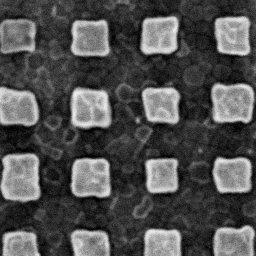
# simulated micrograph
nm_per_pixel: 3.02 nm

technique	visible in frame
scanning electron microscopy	a regular array of raised bodies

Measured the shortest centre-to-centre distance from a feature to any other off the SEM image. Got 0.209 microns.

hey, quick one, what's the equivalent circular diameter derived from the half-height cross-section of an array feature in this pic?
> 0.118 micrometres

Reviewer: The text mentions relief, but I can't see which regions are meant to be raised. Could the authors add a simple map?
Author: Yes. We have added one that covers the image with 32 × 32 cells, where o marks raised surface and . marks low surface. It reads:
................................
................................
..................oooo.....oooo.
.........oooo.....oooo.....oooo.
.........oooo.....oooo.....oooo.
.........ooooo....oooo.....oooo.
.........ooooo....ooo.......ooo.
................................
................................
................................
...........................o....
oo.......oooo.....oooo....oooooo
oooo.....oooo.....oooo....oooooo
ooooo....ooooo....oooo.....ooooo
ooooo....ooooo....oooo.....oooo.
o..o.....ooooo..................
................................
................................
................................
.ooo............................
ooooo....ooooo....oooo.....oooo.
ooooo....ooooo....oooo.....oooo.
ooooo....ooooo....oooo.....oooo.
ooooo....ooooo....oooo.....oooo.
.oooo.....o.o...................
................................
................................
................................
............................o.o.
.ooo.....oooo.....oooo.....ooooo
.oooo....ooooo....oooo.....ooooo
ooooo....ooooo....oooo.....ooooo